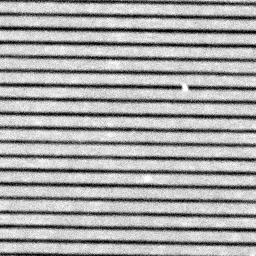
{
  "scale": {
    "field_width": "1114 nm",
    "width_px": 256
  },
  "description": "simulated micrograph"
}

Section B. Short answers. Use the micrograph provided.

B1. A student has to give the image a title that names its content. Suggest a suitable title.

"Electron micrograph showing parallel lines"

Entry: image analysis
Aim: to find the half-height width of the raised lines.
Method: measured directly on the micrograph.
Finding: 46.7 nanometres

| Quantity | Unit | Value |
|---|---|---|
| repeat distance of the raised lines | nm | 61.5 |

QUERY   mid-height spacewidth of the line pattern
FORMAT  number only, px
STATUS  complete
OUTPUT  2.76